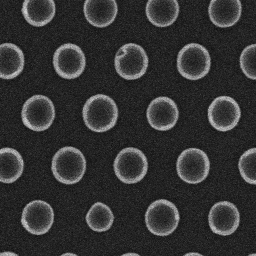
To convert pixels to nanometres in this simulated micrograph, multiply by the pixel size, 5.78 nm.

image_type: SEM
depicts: a regular array of raised bodies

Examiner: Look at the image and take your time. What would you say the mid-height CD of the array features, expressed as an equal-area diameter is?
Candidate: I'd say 33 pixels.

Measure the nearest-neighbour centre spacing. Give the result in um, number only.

0.349